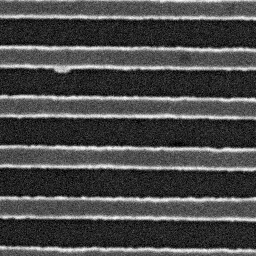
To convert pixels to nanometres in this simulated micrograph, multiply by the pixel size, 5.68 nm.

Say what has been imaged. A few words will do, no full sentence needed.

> lines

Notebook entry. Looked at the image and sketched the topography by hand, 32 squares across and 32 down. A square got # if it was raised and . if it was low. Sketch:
################################
################################
................................
................................
................................
................................
################################
################################
.......##..........#..##########
................................
................................
................................
################################
################################
######.#########################
................................
................................
................................
############.#.##...............
################################
################################
................................
................................
................................
................................
################################
################################
...............................#
................................
................................
................................
################################